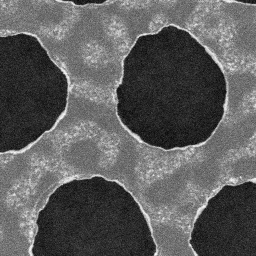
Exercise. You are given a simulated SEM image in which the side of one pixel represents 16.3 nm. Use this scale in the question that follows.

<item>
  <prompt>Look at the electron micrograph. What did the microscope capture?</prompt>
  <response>holes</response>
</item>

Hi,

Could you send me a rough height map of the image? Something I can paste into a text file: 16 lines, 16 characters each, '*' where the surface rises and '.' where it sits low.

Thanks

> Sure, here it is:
****************
****************
..*******...****
...*****.....***
....****......**
....***.......**
....***.......**
....****......**
...******....***
****************
****************
****...********.
***.....*****...
**.......***....
**.......***....
**........**....